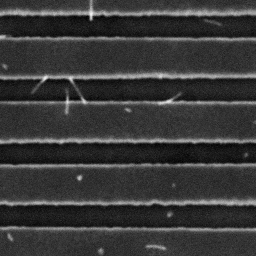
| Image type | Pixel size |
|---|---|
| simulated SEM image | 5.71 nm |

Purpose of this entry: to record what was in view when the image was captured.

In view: lines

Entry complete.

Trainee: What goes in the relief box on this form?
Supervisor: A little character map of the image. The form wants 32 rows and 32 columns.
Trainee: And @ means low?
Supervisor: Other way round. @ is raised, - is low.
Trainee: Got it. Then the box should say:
@@@@@@@@@@@@@@@@@@@@@@@@@@@@@@@@
@@@@@@@@@@@@@@@@@@@@@@@@@@@@@@@@
--------------------------------
--------------------------------
--------------------------------
@@@@@@@@@@@@@@@@@@@@@@@@@@@@@@@@
@@@@@@@@@@@@@@@@@@@@@@@@@@@@@@@@
@@@@@@@@@@@@@@@@@@@@@@@@@@@@@@@@
@@@@@@@@@@@@@@@@@@@@@@@@@@@@@@@@
@@@@@@@@@@@@@@@@@@@@@@@@@@@@@@@@
--------------------------------
--------------------------------
--------------------------------
@@@@@@@@@@@@@@@@@@@@@@@@@@@@@@@@
@@@@@@@@@@@@@@@@@@@@@@@@@@@@@@@@
@@@@@@@@@@@@@@@@@@@@@@@@@@@@@@@@
@@@@@@@@@@@@@@@@@@@@@@@@@@@@@@@@
@@@@@@@@@@@@@@@@@@@@@@@@@@@@@@@@
--------------------------------
--------------------------------
--------------------------------
@@@@@@@@@@@@@@@@@@@@@@@@@@@@@@@@
@@@@@@@@@@@@@@@@@@@@@@@@@@@@@@@@
@@@@@@@@@@@@@@@@@@@@@@@@@@@@@@@@
@@@@@@@@@@@@@@@@@@@@@@@@@@@@@@@@
@@@@@@@@@@@@@@@@@@@-@@@@@@@@@@@@
--------------------------------
--------------------------------
@@@@@@@@@@@@@@@@@@@---@@--------
@@@@@@@@@@@@@@@@@@@@@@@@@@@@@@@@
@@@@@@@@@@@@@@@@@@@@@@@@@@@@@@@@
@@@@@@@@@@@@@@@@@@@@@@@@@@@@@@@@